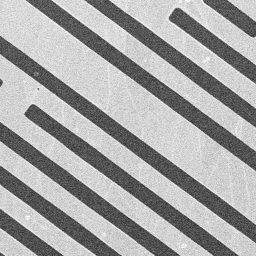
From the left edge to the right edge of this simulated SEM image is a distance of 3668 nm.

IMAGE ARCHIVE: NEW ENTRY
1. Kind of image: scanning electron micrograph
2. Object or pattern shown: groups of lines, slits or small figures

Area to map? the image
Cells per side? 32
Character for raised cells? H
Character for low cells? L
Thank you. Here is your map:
HHHHLLLHHHHLLLHHHHHHHHHHHHLLLHHH
HHHHHLLLHHHHLLLLHHHHHLLHHHHLLLHH
HHHHHHLLLLHHHHLLLHHHHLLLHHHHLLLL
HHHHHHHHLLLHHHHLLLLHHHLLLLHHHHLL
HHHHHHHHHLLLLHHHLLLLHHHHLLLHHHHL
LLHHHHHHHHLLLLHHHHLLLHHHHLLLHHHH
LLLHHHHHHHHHLLLHHHHLLLLHHHLLLLHH
HLLLHHHHHHHHHLLLLHHHHLLLHHHHLLLH
HHLLLLHHHHHHHHLLLLHHHHLLLHHHHLLL
HHHHLLLHHHHHHHHHLLLHHHHLLLLHHHHL
HHHHHLLLHHHHHHHHHLLLHHHHLLLLHHHH
HHHHHHLLLLHHHHHHHHHLLLHHHHLLLHHH
HHHHHHHHLLLHHHHHHHHHLLLHHHHLLLLH
HHHLLHHHHLLLHHHHHHHHHLLLLHHHHLLL
HHHLLLHHHHLLLLHHHHHHHHHLLLHHHHLL
HHHHLLLLHHHHLLLHHHHHHHHHLLLHHHHL
LLHHHHLLLHHHHLLLHHHHHHHHHLLLLHHH
LLLHHHHLLLHHHHLLLLHHHHHHHHHLLLHH
HLLLHHHHLLLLHHHHLLLHHHHHHHHHLLLH
HHLLLLHHHHLLLHHHHLLLHHHHHHHHHLLL
HHHHLLLHHHHLLLHHHHLLLLHHHHHHHHHL
LHHHHLLLLHHHLLLLHHHHLLLHHHHHHHHH
LLLHHHHLLLHHHHLLLHHHHLLLLHHHHHHH
LLLLHHHHLLLHHHHLLLLHHHLLLLHHHHHH
HHLLLHHHHLLLLHHHHLLLHHHHLLLHHHHH
HHHLLLLHHHLLLLHHHHLLLHHHHLLLLHHH
LHHHHLLLHHHHLLLHHHHLLLLHHHLLLLHH
LLHHHHLLLHHHHLLLLHHHHLLLHHHHLLLH
LLLHHHHLLLLHHHHLLLHHHHLLLHHHHLLL
HLLLLHHHHLLLHHHHLLLHHHHLLLLHHHHL
HHHLLLHHHHLLLHHHHLLLLHHHHLLLHHHH
HHHHLLLHHHHLLLLHHHHLLLHHHHLLLHHH